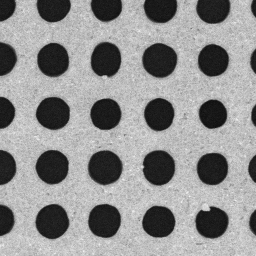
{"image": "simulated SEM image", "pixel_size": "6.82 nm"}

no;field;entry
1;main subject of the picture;a regular array of holes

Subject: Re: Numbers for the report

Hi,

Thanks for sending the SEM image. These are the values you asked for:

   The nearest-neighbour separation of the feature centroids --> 362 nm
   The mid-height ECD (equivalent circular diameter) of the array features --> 220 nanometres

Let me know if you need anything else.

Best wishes